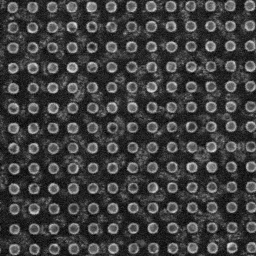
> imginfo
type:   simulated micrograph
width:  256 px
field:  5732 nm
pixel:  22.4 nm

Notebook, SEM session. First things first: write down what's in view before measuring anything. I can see a regular array of raised bodies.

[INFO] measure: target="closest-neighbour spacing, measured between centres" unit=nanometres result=440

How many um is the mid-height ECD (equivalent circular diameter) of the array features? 0.217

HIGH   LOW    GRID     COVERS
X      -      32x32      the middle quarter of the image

-XX---XX---XX---XX---XX---XX---X
-XX---XX---XX---XX---XX---XX---X
--------------------------------
--------------------------------
--------------------------------
-XX---XX---XX---XX---XX---XX---X
-XX---XX---XX---XX---XX---XX---X
--------------------------------
--------------------------------
--------------------------------
-XX---XX---XX---XX---XX---XX---X
-XX---XX---XX---XX---XX---XX---X
--------------------------------
--------------------------------
--------------------------------
-XX---XX---XX---XX---XX---XX---X
-XX---XX---XX---XX---XX---XX---X
--------------------------------
--------------------------------
--------------------------------
-XX---XX---XX---XX---XX---XX---X
-XX---XX---XX---XX---XX---XX---X
--------------------------------
--------------------------------
--------------------------------
-XX---XX---XX---XX---XX---XX---X
-XX---XX---XX---XX---XX---XX---X
--------------------------------
--------------------------------
--------------------------------
-XX---XX---XX---XX---XX---XX---X
-XXX--XX---XX---XX---XX---XX---X